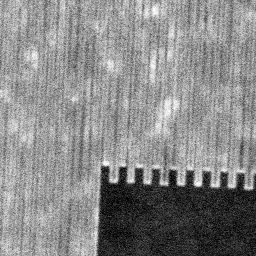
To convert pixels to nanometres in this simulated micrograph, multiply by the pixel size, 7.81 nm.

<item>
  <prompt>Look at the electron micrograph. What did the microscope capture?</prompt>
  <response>parallel lines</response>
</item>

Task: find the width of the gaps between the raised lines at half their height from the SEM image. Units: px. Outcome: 1.87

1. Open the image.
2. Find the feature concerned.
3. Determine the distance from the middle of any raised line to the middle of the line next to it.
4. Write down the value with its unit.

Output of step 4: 66 nm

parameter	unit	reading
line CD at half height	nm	50.7